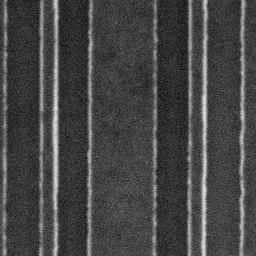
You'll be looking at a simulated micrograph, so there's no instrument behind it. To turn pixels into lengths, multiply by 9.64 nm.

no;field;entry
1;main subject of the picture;lines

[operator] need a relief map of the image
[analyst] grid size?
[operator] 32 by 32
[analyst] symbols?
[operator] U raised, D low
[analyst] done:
UDDDDUUDDDDUUUUUUUUDDDDDUUDDDDUU
UDDDDUUDDDDUUUUUUUUDDDDDUUDDDDUU
UDDDDUUDDDDUUUUUUUUDDDDDUUDDDDUU
UDDDDUUDDDDUUUUUUUUDDDDDUUDDDDUU
UDDDDUUDDDDUUUUUUUUDDDDDUUDDDDUU
UDDDDUUDDDDUUUUUUUUUDDDDUUDDDDUU
UDDDDUUDDDDUUUUUUUUDDDDDUUDDDDUU
UDDDDUUDDDDUUUUUUUUDDDDDUUDDDDUU
UDDDDUUDDDDUUUUUUUUDDDDDUUDDDDUU
UDDDDUUDDDDUUUUUUUUDDDDDUUDDDDUU
UDDDDUUDDDDUUUUUUUUDDDDDUUDDDDUU
UDDDDUUDDDDUUUUUUUUDDDDDUUDDDDUU
UDDDDUUDDDDUUUUUUUUDDDDDUUDDDDUU
UDDDDUUDDDDUUUUUUUUDDDDDUUDDDDUU
UDDDDUUDDDDUUUUUUUUDDDDDUUDDDDUU
UDDDDUUDDDDUUUUUUUUDDDDDUUDDDDUU
UDDDDUUDDDDUUUUUUUUDDDDDUUDDDDUU
UDDDDUUDDDDUUUUUUUUDDDDDUUDDDDUU
UDDDDUUDDDDUUUUUUUUDDDDDUUDDDDUU
UDDDDUUDDDDUUUUUUUUDDDDDUUDDDDUU
UDDDDUUDDDDUUUUUUUUDDDDDUUDDDDUU
UDDDDUUDDDDUUUUUUUUDDDDDUUDDDDUU
UDDDDUUDDDDUUUUUUUUDDDDDUUDDDDUU
UDDDDUUDDDDUUUUUUUUDDDDDUUDDDDUU
UDDDDUUDDDDUUUUUUUUDDDDDUUDDDDUU
UDDDDUUDDDDUUUUUUUUDDDDDUUDDDDUU
UDDDDUUDDDDUUUUUUUUDDDDDUUDDDDUU
UDDDDUUDDDDUUUUUUUUDDDDDUUDDDDUU
UDDDDUUDDDDUUUUUUUUDDDDDUUDDDDUU
UDDDDUUDDDDUUUUUUUUDDDDDUUDDDDUU
UDDDDUUDDDDUUUUUUUUDDDDDUDDDDDUU
UDDDDUUDDDDUUUUUUUUDDDDDUDDDDDUU